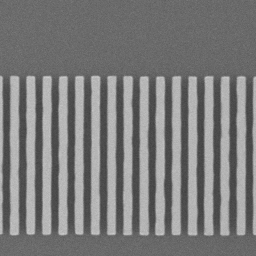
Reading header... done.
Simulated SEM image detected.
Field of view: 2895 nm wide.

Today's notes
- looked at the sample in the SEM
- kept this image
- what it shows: groups of lines, slits or small figures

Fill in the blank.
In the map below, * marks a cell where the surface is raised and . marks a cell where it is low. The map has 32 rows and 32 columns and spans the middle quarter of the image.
................................
................................
................................
*..**..**..**..**..**..**..**..*
*..**..**..**..**..**..**..**..*
*..**..**..**..**..**..**..**..*
*..**..**..**..**..**..**..**..*
*..**..**..**..**..**..**..**..*
*..**..**..**..**..**..**..**..*
*..**..**..**..**..**..**..**..*
*..**..**..**..**..**..**..**..*
*..**..**..**..**..**..**..**..*
*..**..**..**..**..**..**..**..*
*..**..**..**..**..**..**..**..*
*..**..**..**..**..**..**..**..*
*..**..**..**..**..**..**..**..*
*..**..**..**..**..**..**..**..*
*..**..**..**..**..**..**..**..*
*..**..**..**..**..**..**..**..*
*..**..**..**..**..**..**..**..*
*..**..**..**..**..**..**..**..*
*..**..**..**..**..**..**..**..*
*..**..**..**..**..**..**..**..*
*..**..**..**..**..**..**..**..*
*..**..**..**..**..**..**..**..*
*..**..**..**..**..**..**..**..*
*..**..**..**..**..**..**..**..*
*..**..**..**..**..**..**..**..*
*..**..**..**..**..**..**..**..*
*..**..**..**..**..**..**..**..*
*..**..**..**..**..**..**..**..*
*..**..**..**..**..**..**..**..*